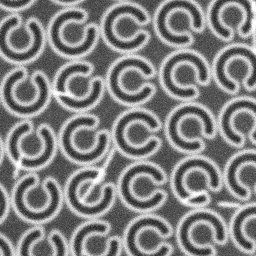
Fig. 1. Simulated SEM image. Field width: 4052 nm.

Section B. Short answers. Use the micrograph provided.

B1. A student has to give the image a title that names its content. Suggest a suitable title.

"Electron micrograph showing an array of small figures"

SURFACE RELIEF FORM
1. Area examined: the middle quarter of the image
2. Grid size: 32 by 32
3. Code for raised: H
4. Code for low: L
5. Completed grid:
HLLLLLHHHHHHLLLLLLLLLLHHHLLLHHHH
LLLLLLLHHHHHLLLHHHHLLLHHLLLHHHHH
LLLLHLHHHHHLLLHHHHHHLLHHLLLHHHHH
LHHHHHHHHHHLLLHHHHHHHHHHLLLHHHHH
LHHHHHHLLHHLLLHHHHHHHHHHHLLLHHHH
LHHHHHHLLLHLLLHHHHHHLLHHHLLLHHHH
LHHHHHHLLLHHLLLHHHHLLLHHHHLLLLLL
HHHHHHLLLHHHLLLLLLLLLLHHHHHLLLLL
LLHHHLLLLHHHHLLLLLLLLHHHHHHHHLLH
LLLLLLLLHHHHHHLLLLLLHHHHHHHHHHHH
LLLLLLLHHHHHHHHHHHHHHHHHHHHHHLLL
HHHLLHHHHHHHHHHHHLLHHHHHHHHHLLLL
HHHHHHHHHHHHHHHLLLLLLLHHHHHLLLLL
HHHLLLLLHHHHHHLLLLLLLLLHHHLLLLHH
HLLLLLLLHHHHHLLLLHHHLLLHHHLLLHHH
LLLLLLLLHHHHHLLLHHHHHLLLHHLLHHHH
LLLHHHHHHHHHHLLHHHHHHHHHHHLLHHHH
LLHHHHHHHLLHLLLHHHHHHHHHHHLLLHHH
LLHHHHHHLLLHHLLHHHHHHHHHHHLLLHHH
LLHHHHHHLLLHHLLLHHHHHLLLHHHLLLLL
LLHHHHHHLLLHHLLLLHHLLLLHHHHHLLLL
LLLHHHHLLLHHHHLLLLLLLLLHHHHHHHLL
LLLLLLLLLLHHHHHLLLLLLLHHHHHHHHHH
HLLLLLLLLHHHHHHHHHHHHHHHHHHHHHHH
HHHLLLLHHHHHHHHHHHHHHHHHHHHHHHLL
HHHHHHHHHHHHHHHHHLLLLLLHHHHHHLLL
HHHHHLLLHHHHHHHHLLLLLLLLHHHHLLLH
HHHLLLLLLHHHHHHLLLLLHLLLLHHHLLHH
HHLLLLLLHHHHHHLLLLHHHHLLLHHLLLHH
HLLLLHHHHHHHHHLLLHHHHHHLHHHLLLHH
HLLLHHHHHHLLHHLLLHHHHHHHHHHLLLHH
HLLHHHHHHHLLLHLLLHHHHHHHHHHHLLLH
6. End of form